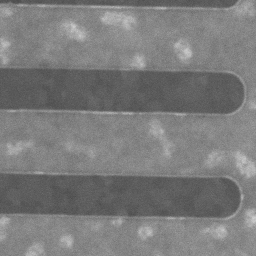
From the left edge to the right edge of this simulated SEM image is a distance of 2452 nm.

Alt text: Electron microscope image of one or a few lines or trenches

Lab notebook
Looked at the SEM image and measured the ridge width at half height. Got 411 nm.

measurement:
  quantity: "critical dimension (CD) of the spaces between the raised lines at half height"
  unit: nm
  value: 594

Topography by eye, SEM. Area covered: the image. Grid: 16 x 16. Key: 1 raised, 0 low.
0000000000011100
0000000000000000
0000000000000000
0000000000000000
1111111111111100
1111111111111110
1111111111111110
0000000000000000
0000000000000000
0000000000000000
0000000000000000
1111111111111110
1111111111111110
0000101111111100
0000000000000000
0000000000000000